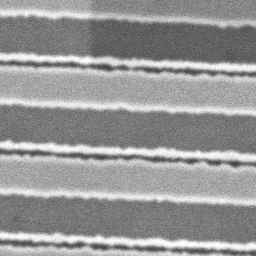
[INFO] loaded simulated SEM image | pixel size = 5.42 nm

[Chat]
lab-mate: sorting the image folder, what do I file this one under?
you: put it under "lines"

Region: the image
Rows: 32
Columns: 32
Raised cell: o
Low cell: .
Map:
oooooooooooooooooooooooooooooooo
oooooooooooooooooooooooooooooooo
................oooooooooooooooo
................................
................................
................................
................................
ooooooooooooooo.o...............
ooooooooooooo.oooooooooooooooooo
oooooooooooooooooooooooooooooooo
oooooooooooooooooooooooooooooooo
oooooooooooooooooooooooooooooooo
oooooooooooooooooooooooooooooooo
................oooooooooooooooo
................................
................................
................................
................................
ooooooooooo.o...................
ooooooooo.oo.ooooooooooooooooooo
ooooooooooooooooooooooooooooo.oo
oooooooooooooooooooooooooooooooo
oooooooooooooooooooooooooooooooo
oooooooooooooooooooooooooooooooo
..........o.oooooooooooooooooooo
................................
................................
................................
................................
oooooooo........................
o...ooooo.ooooooooooooooooooo..o
oooooooooooooooooooooooo..oo.oo.